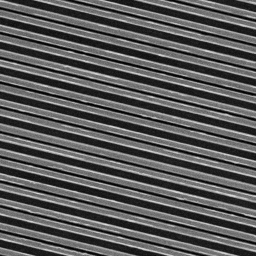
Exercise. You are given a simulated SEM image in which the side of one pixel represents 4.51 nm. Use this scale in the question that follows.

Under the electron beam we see parallel lines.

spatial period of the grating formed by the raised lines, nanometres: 54.1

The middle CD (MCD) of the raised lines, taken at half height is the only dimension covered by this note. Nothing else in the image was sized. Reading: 30.7 nm